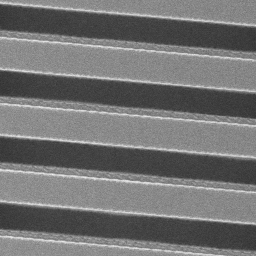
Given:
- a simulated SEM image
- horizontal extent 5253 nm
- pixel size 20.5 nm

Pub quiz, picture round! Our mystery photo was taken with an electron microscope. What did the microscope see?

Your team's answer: lines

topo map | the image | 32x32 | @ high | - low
-@@@@@@@@@@@@@@@@@@@@@@@@@@@@@@@
-------------@@@@@@@@@@@@@@@@@@@
-----------------------@@@@@@@@@
--------------------------------
@@@@@@@-------------------------
@@@@@@@@@@@@@@@@@@--------------
@@@@@@@@@@@@@@@@@@@@@@@@@@@@@@--
@@@@@@@@@@@@@@@@@@@@@@@@@@@@@@@@
@@@@@@@@@@@@@@@@@@@@@@@@@@@@@@@@
---------@@@@@@@@@@@@@@@@@@@@@@@
--------------------@@@@@@@@@@@@
--------------------------------
@@@-----------------------------
@@@@@@@@@@@@@@@-----------------
@@@@@@@@@@@@@@@@@@@@@@@@@@------
@@@@@@@@@@@@@@@@@@@@@@@@@@@@@@@@
@@@@@@@@@@@@@@@@@@@@@@@@@@@@@@@@
-------@@@@@@@@@@@@@@@@@@@@@@@@@
------------------@@@@@@@@@@@@@@
----------------------------@@@@
@-------------------------------
@@@@@@@@@@@@--------------------
@@@@@@@@@@@@@@@@@@@@@@@@--------
@@@@@@@@@@@@@@@@@@@@@@@@@@@@@@@@
@@@@@@@@@@@@@@@@@@@@@@@@@@@@@@@@
---@@@@@@@@@@@@@@@@@@@@@@@@@@@@@
--------------@@@@@@@@@@@@@@@@@@
--------------------------@@@@@@
--------------------------------
@@@@@@@@------------------------
@@@@@@@@@@@@@@@@@@@-------------
@@@@@@@@@@@@@@@@@@@@@@@@@@@@@@@-